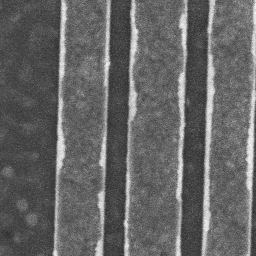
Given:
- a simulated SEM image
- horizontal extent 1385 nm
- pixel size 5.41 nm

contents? one or a few lines or trenches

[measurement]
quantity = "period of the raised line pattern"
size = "0.399 microns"